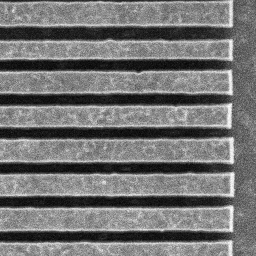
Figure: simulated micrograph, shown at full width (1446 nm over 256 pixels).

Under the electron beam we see parallel lines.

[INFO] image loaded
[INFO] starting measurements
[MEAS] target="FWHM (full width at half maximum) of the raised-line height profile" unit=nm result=129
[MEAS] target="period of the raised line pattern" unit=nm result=194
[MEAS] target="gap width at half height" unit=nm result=62.2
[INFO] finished